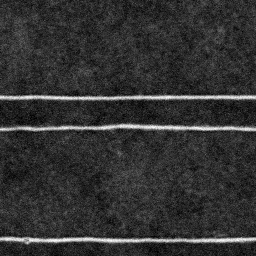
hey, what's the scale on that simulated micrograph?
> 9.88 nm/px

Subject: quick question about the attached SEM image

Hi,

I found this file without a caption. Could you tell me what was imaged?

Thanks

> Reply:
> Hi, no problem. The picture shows one or a few lines or trenches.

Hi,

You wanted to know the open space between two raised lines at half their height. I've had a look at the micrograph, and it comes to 1100 nm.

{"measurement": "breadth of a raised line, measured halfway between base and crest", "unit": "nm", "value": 304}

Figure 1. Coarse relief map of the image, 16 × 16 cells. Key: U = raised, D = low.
DDDDDDDDDDDDDDDD
DDDDDDDDDDDDDDDD
DDDDDDDDDDDDDDDD
DDDDDDDDDDDDDDDD
DDDDDDDDDDDDDDDD
DDDDDDDDDDDDDDDD
UUUUUUUUUUUUUUUU
UUUUUUUUUUUUUUUU
DDDDDDDDDDDDDDDD
DDDDDDDDDDDDDDDD
DDDDDDDDDDDDDDDD
DDDDDDDDDDDDDDDD
DDDDDDDDDDDDDDDD
DDDDDDDDDDDDDDDD
DDDDDDDDDDDDDDDD
UUUUUUUUUUUUUUUU